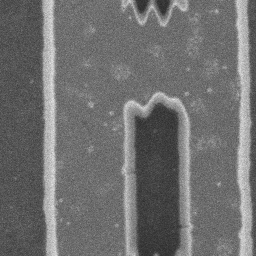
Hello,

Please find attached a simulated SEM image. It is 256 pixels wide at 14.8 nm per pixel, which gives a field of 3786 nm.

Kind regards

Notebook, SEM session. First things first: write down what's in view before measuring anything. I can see one or a few lines or trenches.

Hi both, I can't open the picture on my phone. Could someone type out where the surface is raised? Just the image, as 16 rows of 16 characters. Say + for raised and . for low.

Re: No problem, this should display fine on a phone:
...+++++...++++.
...++++++++++++.
...++++++++++++.
...++++++++++++.
...++++++++++++.
...++++++++++++.
...+++++++.++++.
...+++++...++++.
...+++++...++++.
...+++++...++++.
...+++++....+++.
...+++++....+++.
...+++++....+++.
...+++++....+++.
...+++++....+++.
...+++++....+++.